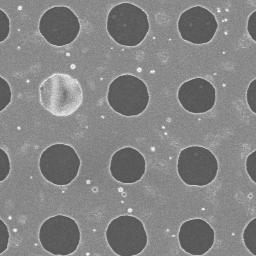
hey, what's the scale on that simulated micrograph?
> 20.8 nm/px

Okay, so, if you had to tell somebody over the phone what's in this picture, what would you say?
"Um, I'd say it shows a regular array of holes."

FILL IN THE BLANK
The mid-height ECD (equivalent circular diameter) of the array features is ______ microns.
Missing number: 0.84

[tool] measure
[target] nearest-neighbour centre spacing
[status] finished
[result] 1430 nm